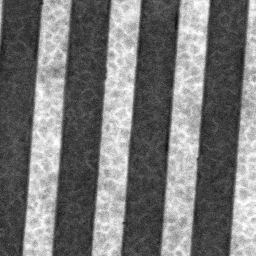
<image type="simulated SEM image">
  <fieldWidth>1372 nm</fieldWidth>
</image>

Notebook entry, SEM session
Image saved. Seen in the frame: one or a few lines or trenches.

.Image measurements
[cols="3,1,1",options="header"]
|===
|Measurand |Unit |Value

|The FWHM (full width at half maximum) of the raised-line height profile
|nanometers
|161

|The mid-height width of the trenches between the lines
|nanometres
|208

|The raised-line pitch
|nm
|369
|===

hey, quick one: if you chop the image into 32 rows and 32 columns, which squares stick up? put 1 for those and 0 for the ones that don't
00000111100000111100000111000001
00000111100000111100001111000001
00000111100000111000001111000001
00000111100000111000001111000001
00000111100000111000001111000001
00000111100001111000001111000001
00000111000001111000001111000001
00000111000001111000001111000001
00000111000001111000001111000001
00000111000001111000001111000011
00001111000001111000001110000011
00001111000001111000001110000011
00001111000001111000001110000011
00001111000001111000001110000011
00001111000001111000011110000011
00001111000001110000011110000011
00001111000001110000011110000011
00001111000001110000011110000011
00001111000011110000011110000011
00001110000011110000011110000011
00001110000011110000011110000011
00001110000011110000011110000011
00001110000011110000011110000111
00001110000011110000011100000111
00001110000011110000011100000111
00011110000011110000011100000111
00011110000011110000011100000111
00011110000011100000111100000111
00011110000011100000111100000111
00011110000011100000111100000111
00011110000011100000111100000111
00011110000111100000111100000111